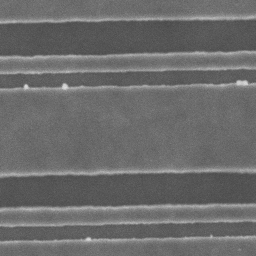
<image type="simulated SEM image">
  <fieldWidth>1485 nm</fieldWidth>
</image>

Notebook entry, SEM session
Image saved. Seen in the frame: lines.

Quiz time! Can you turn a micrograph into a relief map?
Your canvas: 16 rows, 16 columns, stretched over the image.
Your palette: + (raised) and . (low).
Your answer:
++++++++++++++++
................
................
....++++++++++++
++++++++++++++++
++++++++++++++++
++++++++++++++++
++++++++++++++++
++++++++++++++++
++++++++++++++++
++++++++++++++++
................
................
++++++++++++++++
++++++++++++++++
++++++++++++++++